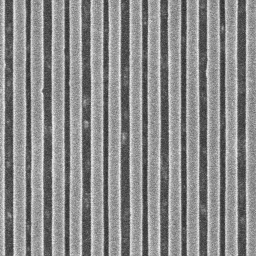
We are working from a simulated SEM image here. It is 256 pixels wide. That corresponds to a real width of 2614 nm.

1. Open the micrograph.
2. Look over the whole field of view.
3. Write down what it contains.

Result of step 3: parallel lines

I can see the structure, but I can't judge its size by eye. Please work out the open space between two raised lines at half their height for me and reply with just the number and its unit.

87.4 nm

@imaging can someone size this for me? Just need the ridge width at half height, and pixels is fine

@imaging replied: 12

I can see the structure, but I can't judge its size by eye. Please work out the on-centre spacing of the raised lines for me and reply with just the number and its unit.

197 nm